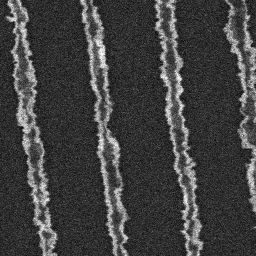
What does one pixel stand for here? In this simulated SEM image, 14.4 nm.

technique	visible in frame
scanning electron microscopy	one or a few lines or trenches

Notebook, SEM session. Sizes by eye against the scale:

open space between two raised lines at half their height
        61.5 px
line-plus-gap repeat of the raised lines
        1050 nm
